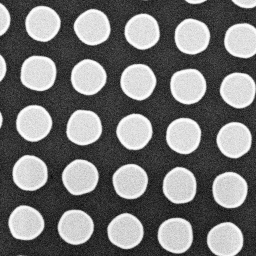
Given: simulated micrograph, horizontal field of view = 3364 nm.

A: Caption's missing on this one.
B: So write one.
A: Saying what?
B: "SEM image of an array of small figures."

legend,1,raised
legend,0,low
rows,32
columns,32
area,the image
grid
00000000000000000000000000000011
10001110000110000000000000000000
10011110001110001110000100000000
10011110011111001111001111000111
00001110001111001111001111001111
00000000000100001110001111001111
00000000000000000000000110000111
00011100000000000000000000000000
10011110011110001110000000000000
00011110011110011110001110001110
00011110011110011110011111001111
00000000001100001110011111001111
00000000000000000000001110001111
00011000000000000000000000000000
00111100011100001100000000000000
00111100111110011110011110001100
00111100111110011110011110011110
00011000011100011110011110011110
00000000000000001100011100011110
00010000000000000000000000001100
00111100011100000000000000000000
00111100111100011100011100000000
00111100111100111100011100011100
00011000111100111100111100011110
00000000000000011000011100011110
00000000000000000000000000011100
00111000110000000000000000000000
01111000111000111000011000000000
01111001111101111100111100011100
00111000111000111100111100111100
00000000010000111000111100111100
00000000000000000000011000011100